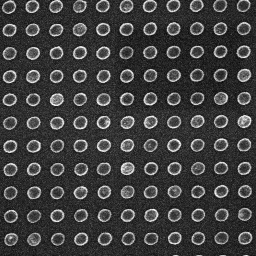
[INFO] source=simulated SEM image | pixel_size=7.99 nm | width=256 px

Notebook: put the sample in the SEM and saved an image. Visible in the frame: a regular array of raised bodies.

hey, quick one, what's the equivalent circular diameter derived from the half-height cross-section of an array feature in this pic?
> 12.6 px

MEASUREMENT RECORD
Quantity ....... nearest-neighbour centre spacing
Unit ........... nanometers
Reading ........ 184